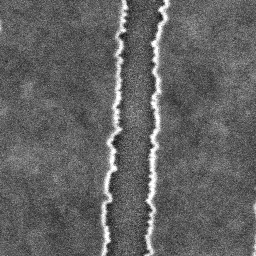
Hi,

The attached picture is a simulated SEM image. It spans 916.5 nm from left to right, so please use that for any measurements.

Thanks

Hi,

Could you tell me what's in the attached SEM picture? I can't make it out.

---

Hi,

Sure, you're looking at one or a few lines or trenches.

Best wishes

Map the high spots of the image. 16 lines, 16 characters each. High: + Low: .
++++++++..++++++
++++++++..++++++
+++++++...++++++
++++++++..++++++
+++++++...++++++
+++++++...++++++
+++++++...++++++
+++++++...++++++
+++++++...++++++
+++++++...++++++
+++++++...++++++
+++++++...++++++
+++++++..+++++++
+++++++..+++++++
+++++++..+++++++
+++++++..+++++++